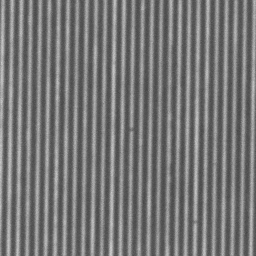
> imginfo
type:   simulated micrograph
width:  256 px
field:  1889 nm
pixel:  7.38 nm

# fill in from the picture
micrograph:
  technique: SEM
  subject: parallel lines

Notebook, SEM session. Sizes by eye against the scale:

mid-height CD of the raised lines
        2.01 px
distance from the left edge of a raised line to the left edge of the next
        68.8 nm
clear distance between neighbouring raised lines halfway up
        7.99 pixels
